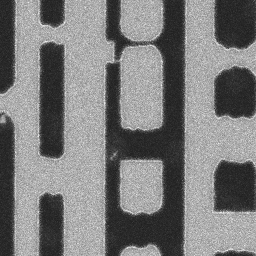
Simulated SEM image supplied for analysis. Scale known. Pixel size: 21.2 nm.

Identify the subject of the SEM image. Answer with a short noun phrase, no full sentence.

one or a few lines or trenches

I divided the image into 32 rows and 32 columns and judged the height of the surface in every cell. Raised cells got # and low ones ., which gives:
##...###.....##.....###....#####
##...###.....##.....###....####.
##...###.....##.....###....#####
##...........##.....###....#####
##...........###....###....#####
##...###......#########....#####
##...###......#.....###.........
##...###......#.....###.........
##...###.....##.....###......##.
##...###.....##.....###....#####
##...###.....##.....###....#####
#....###.....##.....###....#####
.....###.....##.....###....#####
.....###.....##.....###....#####
.....###.....##.....###....#####
.#...###.....##.....###.........
##...###.....##########.........
##...###......#########.........
##...###.......########.........
##...###.......########.........
##...........##.....###....#####
##...........##.....###....#####
##...........##.....###....#####
##...........##.....###....#####
##...###.....##.....###....#####
##...###.....##.....###....#####
##...###.....###.#.####....#####
##...###.....##########.........
##...###.....##########.........
##...###.....##########.........
##...###.....##########.........
##...###.....##.....###....#####